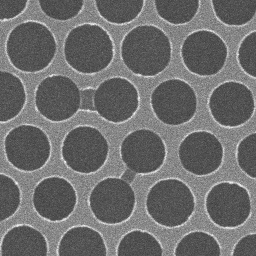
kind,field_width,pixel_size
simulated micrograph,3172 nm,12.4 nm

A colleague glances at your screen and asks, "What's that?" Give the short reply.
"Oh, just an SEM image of a regular array of holes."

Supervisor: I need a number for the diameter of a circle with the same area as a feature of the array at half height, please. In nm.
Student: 569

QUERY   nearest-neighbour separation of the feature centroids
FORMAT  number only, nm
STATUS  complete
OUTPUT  716